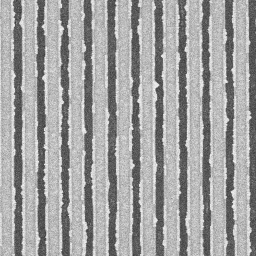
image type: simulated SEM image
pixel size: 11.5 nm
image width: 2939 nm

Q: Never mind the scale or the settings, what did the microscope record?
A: parallel lines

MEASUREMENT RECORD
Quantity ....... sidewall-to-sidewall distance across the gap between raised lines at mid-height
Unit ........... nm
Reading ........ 90.4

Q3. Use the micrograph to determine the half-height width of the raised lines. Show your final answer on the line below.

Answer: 181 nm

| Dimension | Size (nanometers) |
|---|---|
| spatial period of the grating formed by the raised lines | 270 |